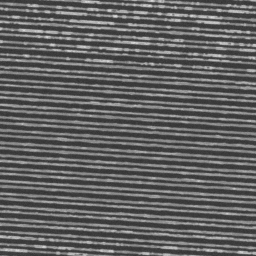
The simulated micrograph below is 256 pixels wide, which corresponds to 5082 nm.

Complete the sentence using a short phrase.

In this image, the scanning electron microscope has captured parallel lines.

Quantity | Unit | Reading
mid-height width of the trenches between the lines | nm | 81.7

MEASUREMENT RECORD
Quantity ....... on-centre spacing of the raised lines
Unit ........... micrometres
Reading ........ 0.125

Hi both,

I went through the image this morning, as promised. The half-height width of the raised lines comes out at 39.6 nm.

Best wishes